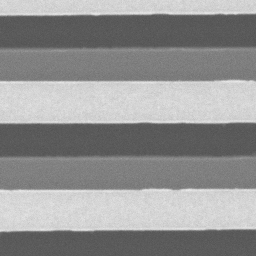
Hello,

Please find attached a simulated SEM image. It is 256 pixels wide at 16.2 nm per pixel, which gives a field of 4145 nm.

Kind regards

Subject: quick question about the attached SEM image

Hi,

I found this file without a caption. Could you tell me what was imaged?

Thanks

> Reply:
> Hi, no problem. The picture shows lines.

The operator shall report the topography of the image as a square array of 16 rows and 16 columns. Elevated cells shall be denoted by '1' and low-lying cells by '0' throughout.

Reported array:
1111111111111111
0000000000000000
0000000000000000
1111111111111111
1111111111111111
1111111111111111
1111111111111111
1111111111111111
0000000000000000
0000000000000000
1111111111111111
1111111111111111
1111111111111111
1111111111111111
0000000000000000
0000000000000000